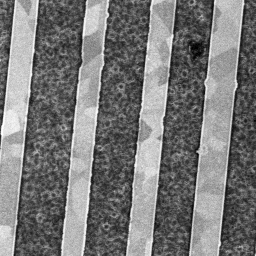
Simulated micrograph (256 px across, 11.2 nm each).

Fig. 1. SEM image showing one or a few lines or trenches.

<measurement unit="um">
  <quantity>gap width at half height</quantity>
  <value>0.491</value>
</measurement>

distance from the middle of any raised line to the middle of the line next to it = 0.741 µm